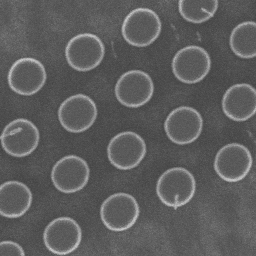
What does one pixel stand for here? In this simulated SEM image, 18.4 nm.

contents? a regular array of raised bodies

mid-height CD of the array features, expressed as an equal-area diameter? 670 nanometres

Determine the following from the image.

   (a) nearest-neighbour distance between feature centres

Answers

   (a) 1130 nm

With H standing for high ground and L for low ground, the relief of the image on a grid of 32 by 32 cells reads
LLLLLLLLLLLLLLLLLLLLLLHHHHHLLLLL
LLLLLLLLLLLLLLLLLHHLLLLHHHHLLLLL
LLLLLLLLLLLLLLLLHHHHLLLLHHLLLLLL
LLLLLLLLLLLLLLLHHHHHLLLLLLLLLLHH
LLLLLLLLLLHHLLLLHHHHLLLLLLLLLHHH
LLLLLLLLLHHHHLLLLHHLLLLLLLLLLHHH
LLLLLLLLHHHHHLLLLLLLLLHHHHLLLHHH
LLLHLLLLLHHHHLLLLLLLLLHHHHLLLLLL
LLHHHLLLLHHHLLLLLLLLLLHHHHLLLLLL
LHHHHHLLLLLLLLLHHHLLLLHHHHLLLLLL
LHHHHLLLLLLLLLLHHHHLLLLLLLLLLLLL
LLHHLLLLLLLLLLLHHHHLLLLLLLLLHHHH
LLLLLLLLHHHLLLLHHHLLLLLLLLLLHHHH
LLLLLLLLHHHHLLLLLLLLLLLHLLLLHHHH
LLLLLLLHHHHHLLLLLLLLLHHHHLLLLHHL
LHHHLLLLHHHLLLLLLLLLLHHHHLLLLLLL
HHHHHLLLLLLLLLLLLLLLLHHHHLLLLLLL
HHHHHLLLLLLLLLHHHHLLLLHHLLLLLLLL
LHHHLLLLLLLLLLHHHHLLLLLLLLLLHHHL
LLLLLLLLLLLLLLHHHHLLLLLLLLLHHHHL
LLLLLLLHHHHLLLHHHLLLLLLLLLLHHHHL
LLLLLLLHHHHLLLLLLLLLLHHLLLLHHHHL
LLLLLLLHHHHLLLLLLLLLHHHHLLLLHHLL
HHHLLLLHHHLLLLLLLLLLHHHHLLLLLLLL
HHHHLLLLLLLLLLHHLLLLHHHHLLLLLLLL
HHHHLLLLLLLLLHHHHLLLLHHLLLLLLLLL
HHHLLLLLLLLLLHHHHLLLLLLLLLLLLLLL
LLLLLLLHHLLLLHHHHLLLLLLLLLLLLLLL
LLLLLLHHHHLLLLHHLLLLLLLLLLLLLLLL
LLLLLLHHHHLLLLLLLLLLLLLLLLLLLLLL
HHLLLLHHHHLLLLLLLLLLLLLLLLLLLLLL
HHHLLLLHHLLLLLLLLLLLLLLLLLLLLLLL